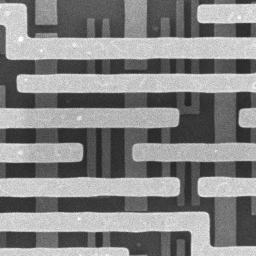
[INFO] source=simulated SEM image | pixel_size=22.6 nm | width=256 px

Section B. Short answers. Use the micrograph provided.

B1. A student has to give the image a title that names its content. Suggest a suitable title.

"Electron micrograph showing wiring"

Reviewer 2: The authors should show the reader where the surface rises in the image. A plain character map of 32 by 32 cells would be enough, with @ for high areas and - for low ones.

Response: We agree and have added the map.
--------------------------------
@@@----------------------@@@@@@@
@@@----------------------@@@@@@@
-@@-----------------------------
-@@@----------------------------
-@@@@@@@@@@@@@@@@@@@@@@@@@@@@@@@
-@@@@@@@@@@@@@@@@@@@@@@@@@@@@@@@
--------------------------------
--------------------------------
--@@@@@@@@@@@@@@@@@@@@@@@@@@@@@@
--@@@@@@@@@@@@@@@@@@@@@@@@@@@@@@
---@@@@@@@@@@@@@---@@----@@@----
--------------------------------
--------------------------------
@@@@@@@@@@@@@@@@@@@@@@--------@@
@@@@@@@@@@@@@@@@@@@@@@--------@@
--------------------------------
--------------------------------
@@@@@@@@@@-------@@@@@@@@@@@@@@@
@@@@@@@@@@-------@@@@@@@@@@@@@@@
--------------------------------
--------------------------------
@@@@@@@@@@@@@@@@@@@@@@---@@@@@@@
@@@@@@@@@@@@@@@@@@@@@@---@@@@@@@
-@@@@-@@@@@@-------------@@@@---
--------------------------------
--------------------------------
@@@@@@@@@@@@@@@@@@@@@@@@@@------
@@@@@@@@@@@@@@@@@@@@@@@@@@------
------------------------@@------
------------------------@@------
@@@@@@@@@@@@@@@@--------@@@@@@@@